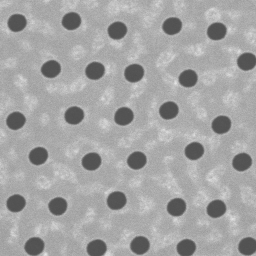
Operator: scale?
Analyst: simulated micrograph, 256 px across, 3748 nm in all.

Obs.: a regular array of holes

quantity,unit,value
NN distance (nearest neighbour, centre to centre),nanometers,624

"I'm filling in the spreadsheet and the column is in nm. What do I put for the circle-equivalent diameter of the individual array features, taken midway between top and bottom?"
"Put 281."